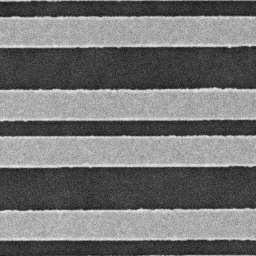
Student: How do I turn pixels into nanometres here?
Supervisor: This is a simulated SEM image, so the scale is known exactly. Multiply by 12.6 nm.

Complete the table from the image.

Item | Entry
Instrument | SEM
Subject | lines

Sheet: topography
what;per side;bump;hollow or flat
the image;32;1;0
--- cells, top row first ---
00000000000000000000000000000000
00000000000000000000000000000000
11111111111111111111111111111111
11111111111111111111111111111111
11111111111111111111111111111111
11111111111111111111111111111111
00000000000000000000000000000000
00000000000000000000000000000000
00000000000000000000000000000000
00000000000000000000000000000000
00000000000000000000000000000000
11111111111111111111111111111111
11111111111111111111111111111111
11111111111111111111111111111111
11111111111111111111111111111111
00000000000000000000000000000000
00000000000000000000000000000000
11111111111111111111111111111111
11111111111111111111111111111111
11111111111111111111111111111111
11111111111111111111111111111111
00000000000000000000000000000000
00000000000000000000000000000000
00000000000000000000000000000000
00000000000000000000000000000000
00000000000000000000000000000000
11111111111111111111111111111111
11111111111111111111111111111111
11111111111111111111111111111111
11111111111111111111111111111111
00000000000000000000000000000000
00000000000000000000000000000000